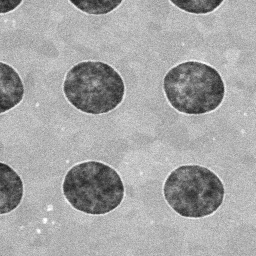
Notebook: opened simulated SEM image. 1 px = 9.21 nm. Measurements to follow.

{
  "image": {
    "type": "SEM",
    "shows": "holes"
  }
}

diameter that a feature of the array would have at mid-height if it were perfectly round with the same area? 57.5 px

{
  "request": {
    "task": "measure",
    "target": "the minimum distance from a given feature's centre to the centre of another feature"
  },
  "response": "922 nm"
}